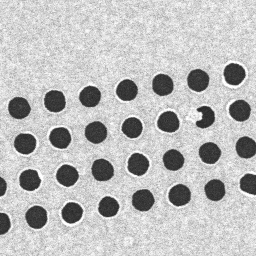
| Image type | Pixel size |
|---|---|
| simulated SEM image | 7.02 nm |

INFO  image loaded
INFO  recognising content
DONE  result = a regular array of holes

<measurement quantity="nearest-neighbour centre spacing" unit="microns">0.251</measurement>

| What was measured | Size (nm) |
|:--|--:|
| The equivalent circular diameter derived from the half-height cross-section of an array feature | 153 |